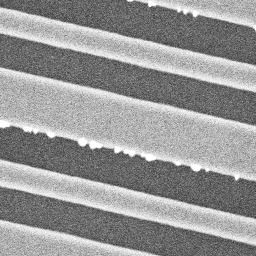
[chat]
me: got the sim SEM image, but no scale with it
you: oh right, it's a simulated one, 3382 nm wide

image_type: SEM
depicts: lines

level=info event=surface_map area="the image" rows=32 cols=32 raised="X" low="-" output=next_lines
-------------------XXXXXXXXXXXXX
XXX---------------------XXXXXXXX
XXXXXXX---------------------XXXX
XXXXXXXXXXX---------------------
--XXXXXXXXXXXXX-----------------
------XXXXXXXXXXXXXX------------
-----------XXXXXXXXXXXXX--------
---------------XXXXXXXXXXXXXX---
-------------------XXXXXXXXXXXXX
XXXX--------------------XXXXXXXX
XXXXXXXXX-------------------XXXX
XXXXXXXXXXXXX-------------------
XXXXXXXXXXXXXXXXX---------------
XXXXXXXXXXXXXXXXXXXXXX----------
XXXXXXXXXXXXXXXXXXXXXXXXXX------
XXXXXXXXXXXXXXXXXXXXXXXXXXXXXXX-
-----XXXXXXXXXXXXXXXXXXXXXXXXXXX
---------XXXXXXXXXXXXXXXXXXXXXXX
--------------XXXXXXXXXXXXXXXXXX
------------------XXXXXXXXXXXXXX
XX--------------------XXXXXXXXXX
XXXXXXX--------------------XXXXX
XXXXXXXXXXX--------------------X
--XXXXXXXXXXXXX-----------------
------XXXXXXXXXXXXX-------------
-----------XXXXXXXXXXXXX--------
--------------XXXXXXXXXXXXXX----
-------------------XXXXXXXXXXXXX
XXXX-------------------XXXXXXXXX
XXXXXXXXX------------------XXXXX
XXXXXXXXXXXXX-------------------
XXXXXXXXXXXXXXXXX---------------